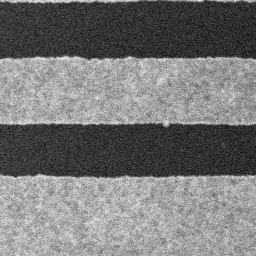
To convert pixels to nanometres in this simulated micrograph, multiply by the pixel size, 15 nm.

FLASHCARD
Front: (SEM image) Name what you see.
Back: one or a few lines or trenches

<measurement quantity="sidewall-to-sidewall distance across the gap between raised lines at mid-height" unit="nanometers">823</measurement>